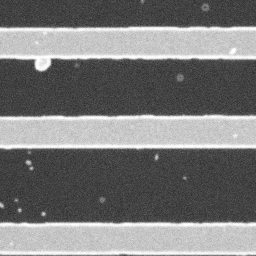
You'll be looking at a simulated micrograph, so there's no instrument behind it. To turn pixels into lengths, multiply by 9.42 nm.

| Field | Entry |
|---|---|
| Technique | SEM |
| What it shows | lines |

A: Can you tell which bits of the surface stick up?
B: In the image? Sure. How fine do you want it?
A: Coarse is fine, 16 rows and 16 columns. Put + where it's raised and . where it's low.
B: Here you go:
................
................
++++++++++++++++
++++++++++++++++
................
................
................
++++++++++++++++
++++++++++++++++
................
................
................
................
................
++++++++++++++++
++++++++++++++++